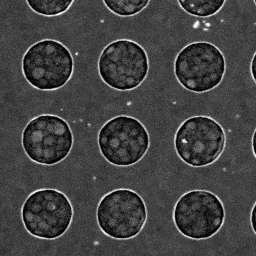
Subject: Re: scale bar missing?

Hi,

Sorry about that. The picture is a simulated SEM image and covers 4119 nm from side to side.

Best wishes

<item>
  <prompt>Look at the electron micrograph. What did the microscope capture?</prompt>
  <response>a regular array of holes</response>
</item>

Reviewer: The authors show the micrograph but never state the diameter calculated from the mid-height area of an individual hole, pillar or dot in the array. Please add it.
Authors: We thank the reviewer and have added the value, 790 nanometres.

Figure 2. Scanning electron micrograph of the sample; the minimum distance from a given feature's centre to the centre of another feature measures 1.19 micrometres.